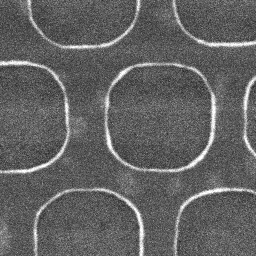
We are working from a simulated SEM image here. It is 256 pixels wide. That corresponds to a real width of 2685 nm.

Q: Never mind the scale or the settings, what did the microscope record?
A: holes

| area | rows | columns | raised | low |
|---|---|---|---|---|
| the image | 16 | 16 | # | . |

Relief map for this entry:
##.......##.....
##......###.....
###....#####....
################
...#####....####
....###......###
....###......##.
....###......##.
....###......##.
....###......###
..#######..#####
################
###.....####....
##.......##.....
##.......##.....
##.......##.....